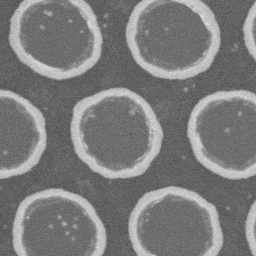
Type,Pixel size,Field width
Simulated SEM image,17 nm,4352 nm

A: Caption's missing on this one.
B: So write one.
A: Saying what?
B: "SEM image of raised bodies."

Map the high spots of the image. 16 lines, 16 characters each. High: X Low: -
-XXXX----XXXX---
-XXXXX--XXXXX---
-XXXXX--XXXXX---
--XXXX---XXXX---
---XX-----XX----
----------------
XX---XXXX----XXX
XX---XXXXX--XXXX
XXX--XXXXX--XXXX
XX---XXXXX--XXXX
XX----XXX----XXX
----------------
--XXX----XXX----
-XXXXX--XXXXX---
-XXXXX--XXXXXX--
-XXXXX---XXXX---